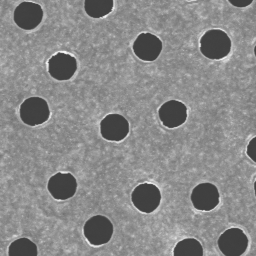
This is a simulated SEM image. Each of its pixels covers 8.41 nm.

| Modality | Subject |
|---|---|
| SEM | a regular array of holes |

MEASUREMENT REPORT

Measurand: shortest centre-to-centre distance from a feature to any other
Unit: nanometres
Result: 498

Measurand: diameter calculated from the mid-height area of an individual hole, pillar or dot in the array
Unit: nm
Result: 238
